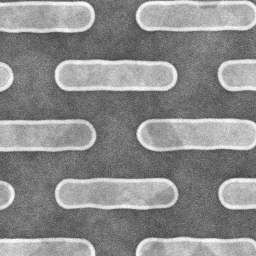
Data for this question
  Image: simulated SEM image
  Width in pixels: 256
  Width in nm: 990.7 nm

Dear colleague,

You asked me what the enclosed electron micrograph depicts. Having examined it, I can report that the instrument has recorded groups of lines, slits or small figures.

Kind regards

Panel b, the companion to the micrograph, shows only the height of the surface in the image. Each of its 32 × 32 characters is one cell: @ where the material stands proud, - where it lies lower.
-@@@@@@@@@@-------@@@@@@@@@@@@@-
@@@@@@@@@@@@-----@@@@@@@@@@@@@@@
@@@@@@@@@@@@-----@@@@@@@@@@@@@@@
@@@@@@@@@@@-------@@@@@@@@@@----
--------------------------------
--------------------------------
--------------------------------
--------------------------------
@------@@@@@@@@@@@@@@@------@@@@
@------@@@@@@@@@@@@@@@-----@@@@@
@------@@@@@@@@@@@@@@@------@@@@
--------------------------------
--------------------------------
--------------------------------
--------------------------------
@@@@@@@@@@@-------@@@@@@@@@@@@@@
@@@@@@@@@@@@-----@@@@@@@@@@@@@@@
@@@@@@@@@@@@------@@@@@@@@@@@@@@
@@@@@@@@@@@--------@@@@--@@--@@-
--------------------------------
--------------------------------
--------------------------------
------------@@------------------
@------@@@@@@@@@@@@@@@------@@@@
@@-----@@@@@@@@@@@@@@@------@@@@
@-------@@@@@@@@@@@@@-------@@@@
--------------------------------
--------------------------------
--------------------------------
--------------------------------
@@@@@@@@@@@-------@@@@@@@@@@@@@@
@@@@@@@@@@@@-----@@@@@@@@@@@@@@@